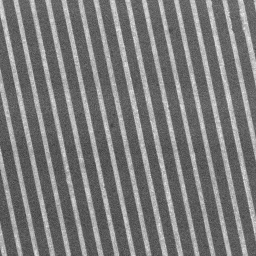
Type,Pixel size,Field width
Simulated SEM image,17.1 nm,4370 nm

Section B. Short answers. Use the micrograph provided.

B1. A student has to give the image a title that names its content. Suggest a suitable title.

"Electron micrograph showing parallel lines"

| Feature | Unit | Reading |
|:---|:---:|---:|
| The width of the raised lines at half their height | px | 11.9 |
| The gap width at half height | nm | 62.6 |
